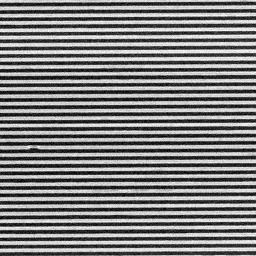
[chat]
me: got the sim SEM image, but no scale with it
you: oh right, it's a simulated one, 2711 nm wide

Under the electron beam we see parallel lines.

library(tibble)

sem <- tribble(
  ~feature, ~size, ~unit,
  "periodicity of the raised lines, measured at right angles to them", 77.7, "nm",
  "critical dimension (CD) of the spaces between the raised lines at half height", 55.6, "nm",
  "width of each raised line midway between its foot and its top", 0.0185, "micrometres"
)